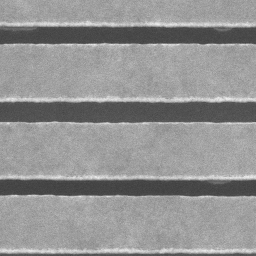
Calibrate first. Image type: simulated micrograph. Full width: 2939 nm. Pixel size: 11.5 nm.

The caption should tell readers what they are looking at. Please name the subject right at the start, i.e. lines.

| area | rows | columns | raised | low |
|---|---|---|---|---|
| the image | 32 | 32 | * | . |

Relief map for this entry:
********************************
********************************
********************************
................................
................................
............**..................
********************************
********************************
********************************
********************************
********************************
********************************
********************************
................................
................................
********************************
********************************
********************************
********************************
********************************
********************************
********************************
................................
................................
.******.......*.................
********************************
********************************
********************************
********************************
********************************
********************************
********************************